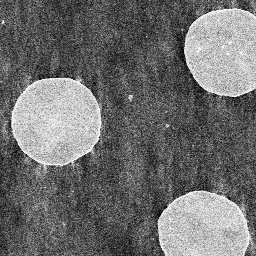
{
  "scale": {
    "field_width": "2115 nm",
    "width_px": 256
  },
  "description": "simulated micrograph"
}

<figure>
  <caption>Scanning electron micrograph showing raised bodies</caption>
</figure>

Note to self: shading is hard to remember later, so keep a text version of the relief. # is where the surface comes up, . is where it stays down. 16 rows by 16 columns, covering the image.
................
............####
............####
............####
............####
..###........###
.#####..........
.#####..........
.#####..........
..###...........
................
................
...........###..
..........#####.
..........######
..........#####.